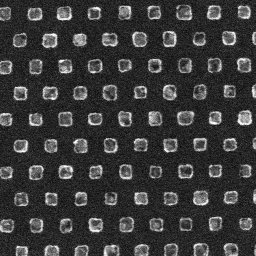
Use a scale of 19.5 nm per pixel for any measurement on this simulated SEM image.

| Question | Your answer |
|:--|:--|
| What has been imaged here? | a regular array of raised bodies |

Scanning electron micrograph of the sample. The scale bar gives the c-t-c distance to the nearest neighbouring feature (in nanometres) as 577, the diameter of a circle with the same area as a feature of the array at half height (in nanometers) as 256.